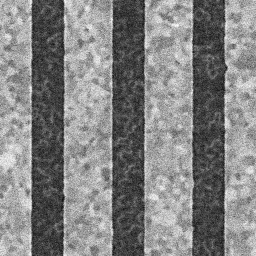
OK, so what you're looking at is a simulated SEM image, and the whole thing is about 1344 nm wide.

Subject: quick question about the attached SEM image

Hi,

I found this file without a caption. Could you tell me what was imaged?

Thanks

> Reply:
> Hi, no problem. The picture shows one or a few lines or trenches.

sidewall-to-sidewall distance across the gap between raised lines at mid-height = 175 nm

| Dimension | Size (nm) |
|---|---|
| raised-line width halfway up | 247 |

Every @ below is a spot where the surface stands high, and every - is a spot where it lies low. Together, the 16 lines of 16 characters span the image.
@@--@@@--@@@--@@
@@--@@@--@@@--@@
@@--@@@--@@@--@@
@@--@@@--@@@--@@
@@--@@@--@@@--@@
@@--@@@--@@@--@@
@@--@@@--@@@--@@
@@--@@@--@@@--@@
@@--@@@--@@@--@@
@@--@@@--@@@--@@
@@--@@@--@@@--@@
@@--@@@--@@@--@@
@@--@@@--@@@--@@
@@--@@@--@@@--@@
@@--@@@--@@@--@@
@@--@@@--@@@--@@